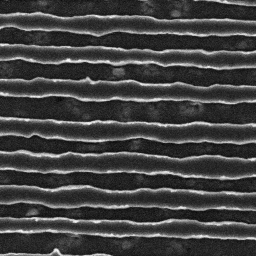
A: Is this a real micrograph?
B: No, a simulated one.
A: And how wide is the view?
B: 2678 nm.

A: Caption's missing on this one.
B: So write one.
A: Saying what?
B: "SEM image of parallel lines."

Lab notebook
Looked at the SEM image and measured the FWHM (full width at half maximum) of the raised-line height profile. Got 0.176 micrometres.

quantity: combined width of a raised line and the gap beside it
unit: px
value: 33.8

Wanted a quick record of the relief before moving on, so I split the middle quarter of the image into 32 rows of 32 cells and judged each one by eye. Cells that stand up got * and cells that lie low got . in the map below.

........................**......
................................
................................
................................
************.*****..............
********************************
********************************
********************************
...*****************************
................................
................................
................................
................................
................................
*.....********..................
********************************
********************************
********************************
*****************...************
........................*******.
................................
................................
****..*...**********............
***************************.....
********************************
********************************
********************************
...........................*****
................................
................................
.....**.........................
**********........****.********.